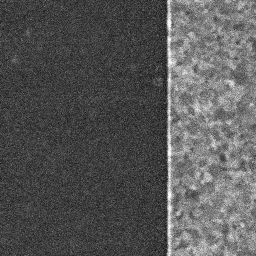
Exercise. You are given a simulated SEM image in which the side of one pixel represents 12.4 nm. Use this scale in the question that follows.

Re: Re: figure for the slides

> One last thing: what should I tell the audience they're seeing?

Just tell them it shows one or a few lines or trenches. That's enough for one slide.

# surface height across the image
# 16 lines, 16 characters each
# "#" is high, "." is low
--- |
...........#####
...........#####
...........#####
...........#####
...........#####
...........#####
...........#####
...........#####
...........#####
...........#####
...........#####
...........#####
...........#####
...........#####
...........#####
...........#####